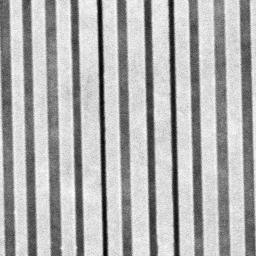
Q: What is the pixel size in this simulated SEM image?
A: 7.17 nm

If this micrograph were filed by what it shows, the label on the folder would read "parallel lines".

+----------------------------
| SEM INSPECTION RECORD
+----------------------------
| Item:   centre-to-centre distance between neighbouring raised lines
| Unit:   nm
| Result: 172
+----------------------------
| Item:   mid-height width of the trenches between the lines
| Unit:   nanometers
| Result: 74.3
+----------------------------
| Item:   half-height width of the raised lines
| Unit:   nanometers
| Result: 102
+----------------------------